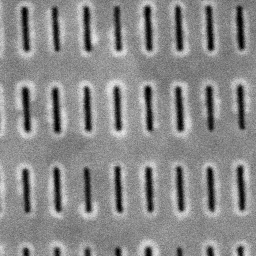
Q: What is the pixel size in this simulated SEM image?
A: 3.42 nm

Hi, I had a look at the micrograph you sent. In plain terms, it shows a regular array of holes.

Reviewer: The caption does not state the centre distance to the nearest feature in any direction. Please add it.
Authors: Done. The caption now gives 104 nm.